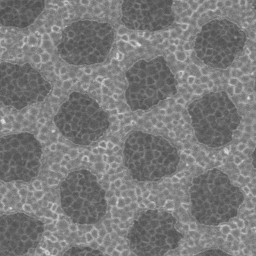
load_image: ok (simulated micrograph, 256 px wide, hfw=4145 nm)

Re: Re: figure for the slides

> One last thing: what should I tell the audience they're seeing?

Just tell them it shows a regular array of raised bodies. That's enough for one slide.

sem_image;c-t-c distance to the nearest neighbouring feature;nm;1220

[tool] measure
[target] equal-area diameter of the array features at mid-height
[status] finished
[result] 844 nanometers